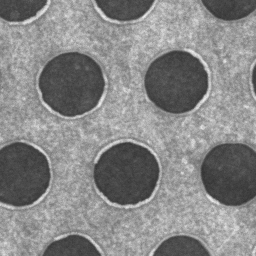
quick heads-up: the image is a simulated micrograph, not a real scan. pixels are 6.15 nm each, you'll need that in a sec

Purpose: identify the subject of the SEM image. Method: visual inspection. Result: holes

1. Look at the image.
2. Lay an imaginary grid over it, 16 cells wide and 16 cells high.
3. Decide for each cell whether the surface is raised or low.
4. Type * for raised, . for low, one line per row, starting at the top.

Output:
...***...****...
****************
****************
****.*****..****
***...***....***
**.....**....***
***...****..****
****************
****************
...****..****...
...***....***...
...***....***...
..*****..****...
****************
****************
***...****...***